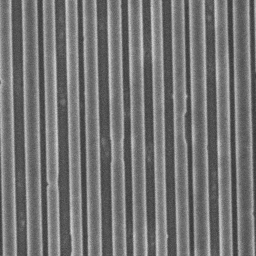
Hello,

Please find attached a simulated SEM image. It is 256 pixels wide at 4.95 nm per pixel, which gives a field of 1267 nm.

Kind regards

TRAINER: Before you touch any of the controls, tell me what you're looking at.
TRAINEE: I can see parallel lines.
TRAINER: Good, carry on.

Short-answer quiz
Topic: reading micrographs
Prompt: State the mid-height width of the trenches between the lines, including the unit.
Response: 8.99 pixels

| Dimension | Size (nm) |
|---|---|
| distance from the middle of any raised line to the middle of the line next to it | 105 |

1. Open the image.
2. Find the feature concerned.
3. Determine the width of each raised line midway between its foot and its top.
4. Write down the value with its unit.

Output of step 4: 67.4 nanometres